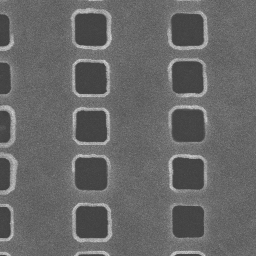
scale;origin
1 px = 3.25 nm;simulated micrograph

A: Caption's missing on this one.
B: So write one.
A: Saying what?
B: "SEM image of a regular array of holes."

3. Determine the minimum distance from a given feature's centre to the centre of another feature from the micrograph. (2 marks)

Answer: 47.9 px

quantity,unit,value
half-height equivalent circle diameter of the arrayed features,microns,0.114